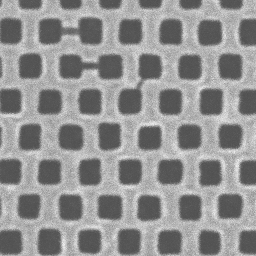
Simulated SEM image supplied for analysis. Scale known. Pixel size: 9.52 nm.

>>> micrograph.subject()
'a regular array of holes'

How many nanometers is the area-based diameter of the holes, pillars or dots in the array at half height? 261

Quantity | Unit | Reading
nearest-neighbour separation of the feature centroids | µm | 0.376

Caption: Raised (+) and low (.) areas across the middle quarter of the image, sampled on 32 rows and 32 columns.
...............++++......+++....
...............++++......+++....
.....+++.......++++.....++++....
....+++++.....+++++.....+++++...
++++++++++++++++++++++++++++++++
++++++++++++++++++++++++++++++++
++++.....+++++.....++++++....+++
++++.....+++++......++++......++
++++......+++.......++++......++
+++......++++.......++++......++
+++......++++.......++++......++
++++......+++......+++++......++
+++++....+++++.....+++++.....+++
++++++++++++++++++++++++++++++++
++++++++++++++++++++++++++++++++
....++++......++++++....+++++...
.....+++......+++++......+++....
.....++++.....+++++......+++....
.....++++.....+++++......+++....
.....++++.....++++.......+++....
.....++++.....+++++.....+++++...
....+++++...+++++++....+++++++..
++++++++++++++++++++++++++++++++
++++++++++++++++++++++++++++++++
++++.....+++++.....+++++......++
++++.....++++.......+++.......++
++++.....++++.......+++.......++
++++.....++++.......+++.......++
++++......+++......++++.......++
++++.....+++++.....+++++.....+++
+++++++.++++++++++++++++++++++++
++++++++++++++++++++++++++++++++